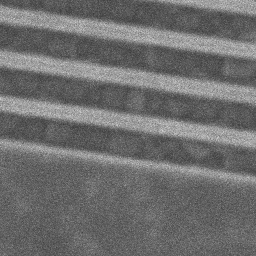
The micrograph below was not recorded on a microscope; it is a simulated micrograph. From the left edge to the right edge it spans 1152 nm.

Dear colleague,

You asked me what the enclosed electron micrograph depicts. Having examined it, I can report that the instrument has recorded parallel lines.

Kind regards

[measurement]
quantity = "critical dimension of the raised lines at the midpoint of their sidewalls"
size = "62.3 nm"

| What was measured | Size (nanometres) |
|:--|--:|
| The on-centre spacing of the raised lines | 197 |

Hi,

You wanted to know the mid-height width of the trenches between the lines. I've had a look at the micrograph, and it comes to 133 nanometers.